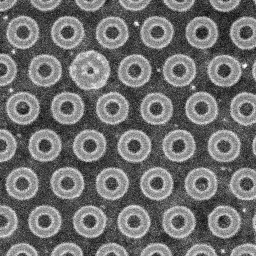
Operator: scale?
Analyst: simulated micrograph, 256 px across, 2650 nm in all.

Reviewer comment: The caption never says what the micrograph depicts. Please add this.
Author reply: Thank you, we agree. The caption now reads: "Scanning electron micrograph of a regular array of ring-shaped raised bodies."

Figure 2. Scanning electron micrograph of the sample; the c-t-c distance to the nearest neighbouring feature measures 452 nanometres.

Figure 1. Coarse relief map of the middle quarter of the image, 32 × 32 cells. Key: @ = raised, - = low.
--@@@@@@@@@---@@---@@----@@----@
--@@@@--@@@---@@---@@----@@----@
--@@@@-@@@@---@@---@@----@@----@
--@@@@@@@@@---@@@--@@-----@@@@@@
---@@@@@@@-----@@@@@------@@@@@-
----@@@@@-----------------------
--------------------------------
@@---------@@---------@@--------
@@@@-----@@@@@@-----@@@@@@-----@
--@@-----@@--@@@----@@-@@@-----@
---@@---@@----@@---@@----@@----@
---@@---@@@---@@---@@----@@----@
--@@----@@@--@@@----@@--@@@----@
@@@@-----@@@@@@-----@@@@@@-----@
@@@--------@@@-------@@@@-------
--------------------------------
--------------------------------
----@@@@@------@@@@@------@@@@@-
---@@@@@@@----@@@@@@@----@@@@@@@
---@@---@@----@@---@@----@@---@@
---@@---@@----@-----@----@@----@
---@@---@@----@@---@@----@@---@@
---@@@@@@@----@@@@@@@-----@@-@@@
----@@@@@------@@@@@------@@@@@-
--------------------------------
--------------------------------
@@@-------@@@---------@@@-------
@@@@-----@@@@@@-----@@@@@@-----@
--@@@---@@@--@@@----@@---@@----@
---@@---@@----@@---@@----@@----@
---@@---@@----@@---@@----@@----@
--@@----@@@--@@-----@@--@@@----@